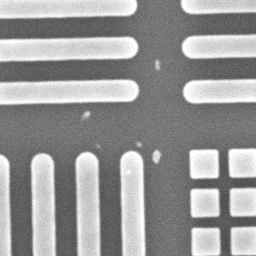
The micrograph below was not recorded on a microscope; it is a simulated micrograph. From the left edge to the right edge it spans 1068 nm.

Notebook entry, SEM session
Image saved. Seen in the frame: groups of lines, slits or small figures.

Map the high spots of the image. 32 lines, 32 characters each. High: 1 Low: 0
11111111111111111000000111111111
11111111111111111000000111111100
00000000000000000000000000000000
00000000000000000000000000000000
00000000000000000000000000000000
11111111111111111000000111111111
11111111111111111000000111111111
11110000000000000000000000000000
00000000000000000000000000000000
00000000000000000000000000000000
11111111111111111000000011111111
11111111111111111000000111111111
11111111111111110000000011111111
00000000000000000000000000000000
00000000000000000000000000000000
00000000000000000000000000000000
00000000000000000000000000000000
00000000000000000000000000000000
00000000000000000000000000000000
00000100001100011000000011100111
10001110001100011100000011100111
10001110001100011100000011100111
10001110001100011100000000000000
10001110001100011100000000000000
10001110001100011100000011100111
10001110001100011100000011100111
10001110001100011100000011100111
10001110001100011100000000000000
10001110001100011100000000000011
10001110001100011100000011100111
10001110001100011100000011100111
10001110001100011100000011100111